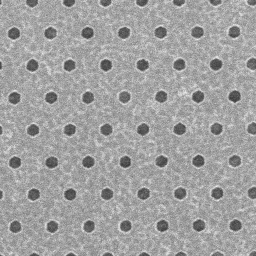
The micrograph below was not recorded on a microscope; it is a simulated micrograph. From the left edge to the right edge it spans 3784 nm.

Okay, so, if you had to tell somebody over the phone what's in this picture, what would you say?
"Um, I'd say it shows a regular array of holes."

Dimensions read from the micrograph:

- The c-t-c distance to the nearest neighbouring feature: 541 nm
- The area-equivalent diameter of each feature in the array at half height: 193 nanometres